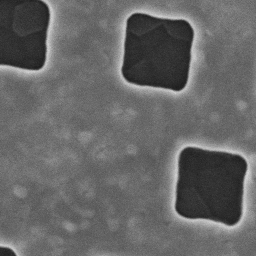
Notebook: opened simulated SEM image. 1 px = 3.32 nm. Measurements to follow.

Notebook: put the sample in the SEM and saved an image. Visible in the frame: holes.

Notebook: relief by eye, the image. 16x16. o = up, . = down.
...ooooooooooooo
...ooooo....oooo
...ooooo....oooo
...ooooo....oooo
oooooooo....oooo
oooooooooo.ooooo
oooooooooooooooo
oooooooooooooooo
oooooooooooooooo
ooooooooooo...oo
ooooooooooo....o
ooooooooooo....o
ooooooooooo....o
ooooooooooo....o
oooooooooooooooo
oooooooooooooooo